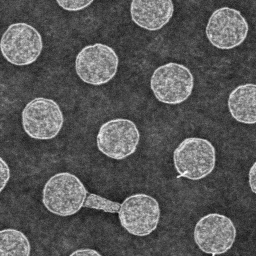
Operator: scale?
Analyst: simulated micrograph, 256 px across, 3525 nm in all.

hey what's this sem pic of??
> raised bodies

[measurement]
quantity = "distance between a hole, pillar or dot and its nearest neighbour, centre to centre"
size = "1.06 micrometres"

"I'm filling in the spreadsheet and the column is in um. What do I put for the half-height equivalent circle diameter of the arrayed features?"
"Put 0.553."